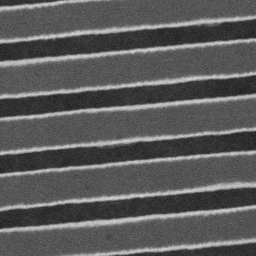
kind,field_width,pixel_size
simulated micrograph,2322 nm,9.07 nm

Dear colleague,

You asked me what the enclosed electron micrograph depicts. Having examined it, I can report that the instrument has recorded lines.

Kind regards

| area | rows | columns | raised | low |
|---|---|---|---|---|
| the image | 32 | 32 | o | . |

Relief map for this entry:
....oooooooooooooooooooooooooooo
oooooooooooooooooooooooooooooooo
oooooooooooooooooooooooooooooo..
ooooooooooooooooooo.............
ooooooooo.......................
.........................ooooooo
..............oooooooooooooooooo
....oooooooooooooooooooooooooooo
oooooooooooooooooooooooooooooooo
ooooooooooooooooooooooooooooooo.
ooooooooooooooooooo.............
oooooooooo......................
........................oooooooo
.............ooooooooooooooooooo
....oooooooooooooooooooooooooooo
oooooooooooooooooooooooooooooooo
ooooooooooooooooooooooooooooo...
oooooooooooooooooooo............
oooooooo........................
.......................ooooooooo
..............oooooooooooooooooo
...ooooooooooooooooooooooooooooo
oooooooooooooooooooooooooooooooo
oooooooooooooooooooooooooooo....
ooooooooooooooooooo.............
ooooooo.........................
........................oooooooo
..............oooooooooooooooooo
..oooooooooooooooooooooooooooooo
oooooooooooooooooooooooooooooooo
oooooooooooooooooooooooooooooo..
oooooooooooooooooo..............